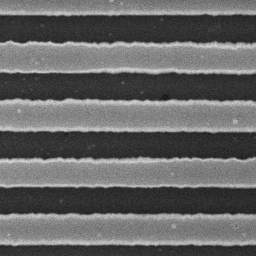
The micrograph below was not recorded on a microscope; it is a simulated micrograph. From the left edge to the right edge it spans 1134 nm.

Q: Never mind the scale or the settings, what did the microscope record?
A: lines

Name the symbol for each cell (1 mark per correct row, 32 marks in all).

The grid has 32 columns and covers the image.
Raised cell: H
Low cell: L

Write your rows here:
HHHHHHHHHHHHHHHHHHHHHHHHHHHHHHHH
HHHHHHHHHHHHHHHHHHHHHHHHHHHHHHHH
LLLLLLLLLLLLLLLLLLLLLLLLLLLLLLLL
LLLLLLLLLLLLLLLLLLLLLLLLLLLLLLLL
LLLLLLLLLLLLLLLLLLLLLLLLLLLLLLLL
HHHHHHHHHHHHHHHHHHHHHHHHLLHLHLLL
HHHHHHHHHHHHHHHHHHHHHHHHHHHHHHHH
HHHHHHHHHHHHHHHHHHHHHHHHHHHHHHHH
HHHHHHHHHHHHHHHHHHHHHHHHHHHHHHHH
LLLLLLLLLLLLLLLLLLLLLLLLLLLLLLLL
LLLLLLLLLLLLLLLLLLLLLLLLLLLLLLLL
LLLLLLLLLLLLLLLLLLLLLLLLLLLLLLLL
LHHLLLLLHHHHLLLLLLLLLHLLLLLLLLLL
HHHHHHHHHHHHHHHHHHHHHHHHHHHHHHHH
HHHHHHHHHHHHHHHHHHHHHHHHHHHHHHHH
HHHHHHHHHHHHHHHHHHHHHHHHHHHHHHHH
LLLLLLLLLLLLLLLLLLLLLLLLLLLLLLLL
LLLLLLLLLLLLLLLLLLLLLLLLLLLLLLLL
LLLLLLLLLLLLLLLLLLLLLLLLLLLLLLLL
LLLLLLLLLLLLLLLLLLLLLLLLLLLLLLLL
HHHHHHHHHHHHHHHHHHHHHHHHHHHHHHHH
HHHHHHHHHHHHHHHHHHHHHHHHHHHHHHHH
HHHHHHHHHHHHHHHHHHHHHHHHHHHHHHHH
LLLLLLLLLLLLLLLLLLLLLLLLLLLLLLLL
LLLLLLLLLLLLLLLLLLLLLLLLLLLLLLLL
LLLLLLLLLLLLLLLLLLLLLLLLLLLLLLLL
LLLLLLLLLLLLLLLLLLLLLLLLLLLLLLLL
HHHHHHHHHHHHHHHHHHHHHHHHHHHHHHHH
HHHHHHHHHHHHHHHHHHHHHHHHHHHHHHHH
HHHHHHHHHHHHHHHHHHHHHHHHHHHHHHHH
HHHHLHHLHHHHHHLHHHHHHHHHHHHHHHHL
LLLLLLLLLLLLLLLLLLLLLLLLLLLLLLLL